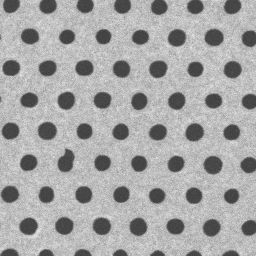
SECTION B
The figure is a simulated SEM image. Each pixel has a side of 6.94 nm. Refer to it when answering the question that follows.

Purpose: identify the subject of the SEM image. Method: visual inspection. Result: a regular array of holes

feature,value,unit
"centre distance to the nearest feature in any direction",36.1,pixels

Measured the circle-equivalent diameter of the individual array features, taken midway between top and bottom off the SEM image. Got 117 nm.